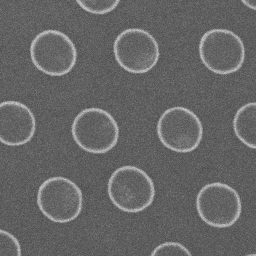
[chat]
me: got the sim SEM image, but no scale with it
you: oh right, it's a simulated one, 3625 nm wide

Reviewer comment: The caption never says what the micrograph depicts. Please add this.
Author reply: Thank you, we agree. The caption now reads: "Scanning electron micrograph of a regular array of raised bodies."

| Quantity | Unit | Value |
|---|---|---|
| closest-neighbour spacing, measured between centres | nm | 1130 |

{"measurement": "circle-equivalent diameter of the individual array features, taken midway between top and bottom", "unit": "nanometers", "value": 606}